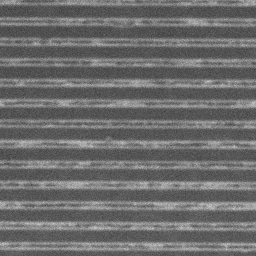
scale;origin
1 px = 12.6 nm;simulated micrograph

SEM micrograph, parallel lines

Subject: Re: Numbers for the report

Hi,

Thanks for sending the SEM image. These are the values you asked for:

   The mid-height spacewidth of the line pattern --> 0.186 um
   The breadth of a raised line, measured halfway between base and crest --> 0.0711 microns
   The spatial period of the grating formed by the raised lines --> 20.4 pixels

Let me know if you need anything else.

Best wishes